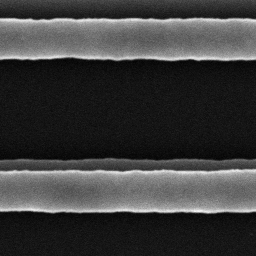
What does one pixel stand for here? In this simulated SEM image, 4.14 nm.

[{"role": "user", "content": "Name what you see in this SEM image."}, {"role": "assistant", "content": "lines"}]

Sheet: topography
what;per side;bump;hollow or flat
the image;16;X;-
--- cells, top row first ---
XXXXXXXXXXXXXXXX
XXXXXXXXXXXXXXXX
XXXXXXXXXXXXXXXX
XXXXXXXXXXXXXXXX
----------------
----------------
----------------
----------------
----------------
----------------
XXXXXXXXXXXXXXXX
XXXXXXXXXXXXXXXX
XXXXXXXXXXXXXXXX
----------------
----------------
----------------